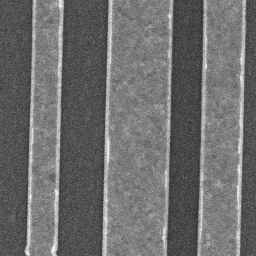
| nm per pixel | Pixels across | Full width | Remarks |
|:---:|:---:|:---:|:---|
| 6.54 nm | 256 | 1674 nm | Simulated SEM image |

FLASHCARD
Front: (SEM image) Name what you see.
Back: one or a few lines or trenches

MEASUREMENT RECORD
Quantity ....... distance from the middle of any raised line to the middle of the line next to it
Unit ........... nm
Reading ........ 578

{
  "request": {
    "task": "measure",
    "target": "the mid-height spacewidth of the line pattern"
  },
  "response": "263 nanometres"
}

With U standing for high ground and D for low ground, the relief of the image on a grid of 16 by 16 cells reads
DDUUDDDUUUUDDUUD
DDUUDDDUUUUDDUUD
DDUUDDDUUUUDDUUD
DDUUDDDUUUUDDUUD
DDUUDDDUUUUDDUUD
DDUUDDDUUUUDDUUD
DDUUDDDUUUUDDUUD
DDUUDDDUUUUDDUUD
DDUUDDDUUUUDDUUD
DDUUDDDUUUDDDUUD
DDUUDDDUUUDDDUUD
DDUUDDDUUUDDDUUD
DDUUDDDUUUDDDUUD
DDUUDDDUUUDDUUUD
DDUUDDDUUUDDUUUD
DDUDDDDUUUDDUUUD